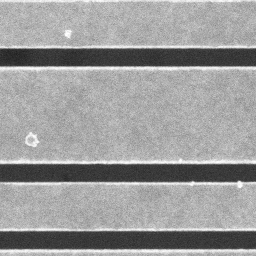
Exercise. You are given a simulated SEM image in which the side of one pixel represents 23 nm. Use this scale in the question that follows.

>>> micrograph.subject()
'lines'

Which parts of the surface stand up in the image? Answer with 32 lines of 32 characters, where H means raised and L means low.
HHHHHHHHHHHHHHHHHHHHHHHHHHHHHHHH
HHHHHHHHHHHHHHHHHHHHHHHHHHHHHHHH
HHHHHHHHHHHHHHHHHHHHHHHHHHHHHHHH
HHHHHHHHHHHHHHHHHHHHHHHHHHHHHHHH
HHHHHHHHHHHHHHHHHHHHHHHHHHHHHHHH
HHHHHHHHHHHHHHHHHHHHHHHHHHHHHHHH
LLLLLLLLLLLLLLLLLLLLLLLLLLLLLLLL
LLLLLLLLLLLLLLLLLLLLLLLLLLLLLLLL
HHHHHHHHHHHHHHHHHHHHHHHHHHHHHHHH
HHHHHHHHHHHHHHHHHHHHHHHHHHHHHHHH
HHHHHHHHHHHHHHHHHHHHHHHHHHHHHHHH
HHHHHHHHHHHHHHHHHHHHHHHHHHHHHHHH
HHHHHHHHHHHHHHHHHHHHHHHHHHHHHHHH
HHHHHHHHHHHHHHHHHHHHHHHHHHHHHHHH
HHHHHHHHHHHHHHHHHHHHHHHHHHHHHHHH
HHHHHHHHHHHHHHHHHHHHHHHHHHHHHHHH
HHHHHHHHHHHHHHHHHHHHHHHHHHHHHHHH
HHHHHHHHHHHHHHHHHHHHHHHHHHHHHHHH
HHHHHHHHHHHHHHHHHHHHHHHHHHHHHHHH
HHHHHHHHHHHHHHHHHHHHHHHHHHHHHHHH
LLLLLLLLLLLLLLLLLLLLLLLLLLLLLLLL
LLLLLLLLLLLLLLLLLLLLLLLLLLLLLLLL
LLLLLLLLLLLLLLLLLLLLLLLLLLLLLLLL
HHHHHHHHHHHHHHHHHHHHHHHHHHHHHHHH
HHHHHHHHHHHHHHHHHHHHHHHHHHHHHHHH
HHHHHHHHHHHHHHHHHHHHHHHHHHHHHHHH
HHHHHHHHHHHHHHHHHHHHHHHHHHHHHHHH
HHHHHHHHHHHHHHHHHHHHHHHHHHHHHHHH
HHHHHHHHHHHHHHHHHHHHHHHHHHHHHHHH
LLLLLLLLLLLLLLLLLLLLLLLLLLLLLLLL
LLLLLLLLLLLLLLLLLLLLLLLLLLLLLLLL
HHHHHHHHHHHHHHHHHHHHHHHHHHHHHHHH